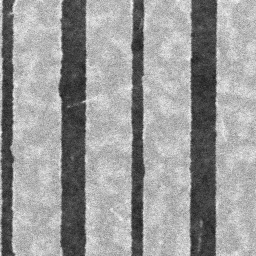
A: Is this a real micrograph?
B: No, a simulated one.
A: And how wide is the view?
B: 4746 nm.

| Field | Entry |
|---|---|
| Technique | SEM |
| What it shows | one or a few lines or trenches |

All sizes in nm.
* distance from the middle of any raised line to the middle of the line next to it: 1200